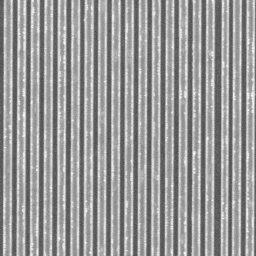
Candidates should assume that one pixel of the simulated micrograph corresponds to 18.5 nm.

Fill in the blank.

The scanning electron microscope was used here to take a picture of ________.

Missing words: parallel lines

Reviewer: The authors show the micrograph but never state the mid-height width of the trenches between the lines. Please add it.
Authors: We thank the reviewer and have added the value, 120 nanometers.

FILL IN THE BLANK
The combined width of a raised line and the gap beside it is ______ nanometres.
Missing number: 250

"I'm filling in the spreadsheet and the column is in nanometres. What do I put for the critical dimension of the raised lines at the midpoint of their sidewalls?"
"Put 137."